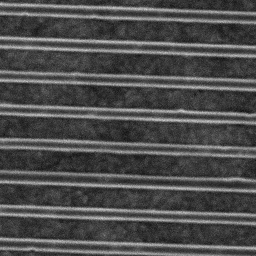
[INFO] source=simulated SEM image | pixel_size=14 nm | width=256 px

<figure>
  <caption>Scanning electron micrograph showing parallel lines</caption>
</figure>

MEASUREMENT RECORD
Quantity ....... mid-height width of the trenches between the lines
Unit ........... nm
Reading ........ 320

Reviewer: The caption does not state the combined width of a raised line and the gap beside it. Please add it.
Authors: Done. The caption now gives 470 nm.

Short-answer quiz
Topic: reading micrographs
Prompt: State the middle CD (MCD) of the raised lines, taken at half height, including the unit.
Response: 145 nanometres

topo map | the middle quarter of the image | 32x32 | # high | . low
................................
................................
##..............................
#############################...
################################
.........................#######
................................
................................
................................
................................
................................
##############...####...........
################################
..........######################
................................
................................
................................
................................
................................
######..........................
################################
..##############################
.............................###
................................
................................
................................
................................
####............................
###############################.
################################
........########################
................................